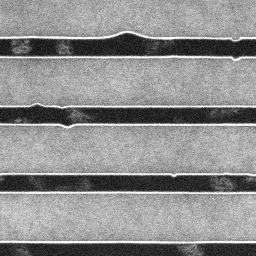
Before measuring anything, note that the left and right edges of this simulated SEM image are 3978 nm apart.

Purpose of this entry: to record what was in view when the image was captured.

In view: one or a few lines or trenches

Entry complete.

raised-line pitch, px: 67.9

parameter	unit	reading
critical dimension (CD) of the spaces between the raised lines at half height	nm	760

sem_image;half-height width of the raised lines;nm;303